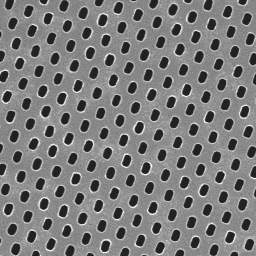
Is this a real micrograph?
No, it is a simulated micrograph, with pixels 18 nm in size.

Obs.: a regular array of holes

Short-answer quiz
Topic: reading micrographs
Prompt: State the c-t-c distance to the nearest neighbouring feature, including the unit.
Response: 0.362 um